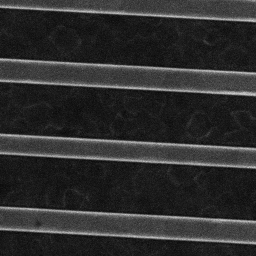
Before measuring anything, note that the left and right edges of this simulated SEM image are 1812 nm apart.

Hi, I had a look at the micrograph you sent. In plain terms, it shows one or a few lines or trenches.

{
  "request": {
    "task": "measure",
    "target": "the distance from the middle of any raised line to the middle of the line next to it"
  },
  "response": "524 nm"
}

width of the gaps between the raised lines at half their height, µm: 0.374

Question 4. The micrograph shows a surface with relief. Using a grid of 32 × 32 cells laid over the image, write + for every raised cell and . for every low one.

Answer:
++++++++++++++++++++++++++++++++
............++++++++++++++++++++
..............................++
................................
................................
................................
................................
++..............................
++++++++++++++++++++............
++++++++++++++++++++++++++++++++
.......+++++++++++++++++++++++++
.........................+++++++
................................
................................
................................
................................
................................
+++++++++++.....................
+++++++++++++++++++++++++++++...
.....+++++++++++++++++++++++++++
.......................+++++++++
................................
................................
................................
................................
................................
+++++++++++.....................
+++++++++++++++++++++++++++++...
++++++++++++++++++++++++++++++++
...............+++++++++++++++++
................................
................................